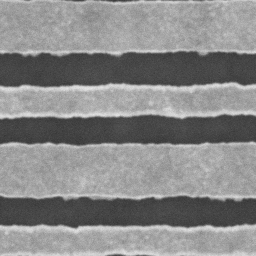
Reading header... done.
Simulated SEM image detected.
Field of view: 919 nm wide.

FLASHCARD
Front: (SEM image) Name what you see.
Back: lines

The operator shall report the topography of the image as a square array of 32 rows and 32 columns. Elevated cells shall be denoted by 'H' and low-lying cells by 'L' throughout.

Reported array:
HHHHHHHHHHHHHHHHHHHHHHHHHHHHHHHH
HHHHHHHHHHHHHHHHHHHHHHHHHHHHHHHH
HHHHHHHHHHHHHHHHHHHHHHHHHHHHHHHH
HHHHHHHHHHHHHHHHHHHHHHHHHHHHHHHH
HHHHHHHHHHHHHHHHHHHHHHHHHHHHHHHH
HHHHHHHHHHHHHHHHHHHHHHHHHHHHHHHH
HHHHHHHHHHHHHHHHLHHHHLLLLLLLLHHH
LLLLLLLLLLLLLLLLLLLLLLLLLLLLLLLL
LLLLLLLLLLLLLLLLLLLLLLLLLLLLLLLL
LLLLLLLLLLLLLLLLLLLLLLLLLLLLLLLL
LLLLLLLLLLLLLLLLLLLLLLLLLLLLHHLL
HHHHHHHHHHHHHHHHHHHHHHHHHHHHHHHH
HHHHHHHHHHHHHHHHHHHHHHHHHHHHHHHH
HHHHHHHHHHHHHHHHHHHHHHHHHHHHHHHH
HHHHHLLHHLHLLLLLLLLLLLHLLLLLLLLL
LLLLLLLLLLLLLLLLLLLLLLLLLLLLLLLL
LLLLLLLLLLLLLLLLLLLLLLLLLLLLLLLL
LLLLLLLLLLLLLLLLLLLLLLLLLLLLLLLL
HHHHHHHHHHHHHHHHHHHHHHHHHHHHHHHH
HHHHHHHHHHHHHHHHHHHHHHHHHHHHHHHH
HHHHHHHHHHHHHHHHHHHHHHHHHHHHHHHH
HHHHHHHHHHHHHHHHHHHHHHHHHHHHHHHH
HHHHHHHHHHHHHHHHHHHHHHHHHHHHHHHH
HHHHHHHHHHHHHHHHHHHHHHHHHHHHHHHH
LHHHHHHLLLLLLLHHHHHHHLLLHLHHHHHH
LLLLLLLLLLLLLLLLLLLLLLLLLLLLLLLL
LLLLLLLLLLLLLLLLLLLLLLLLLLLLLLLL
LLLLLLLLLLLLLLLLLLLLLLLLLLLLLLLL
HHHHHHHHLLHHHHHLHHHHHHLLHHHLLHHH
HHHHHHHHHHHHHHHHHHHHHHHHHHHHHHHH
HHHHHHHHHHHHHHHHHHHHHHHHHHHHHHHH
HHHHHHHHHHHHHHHHHHHHHHHHHHHHHHHH